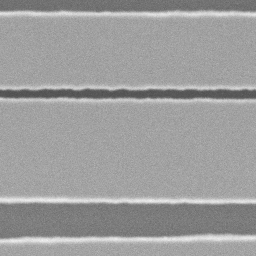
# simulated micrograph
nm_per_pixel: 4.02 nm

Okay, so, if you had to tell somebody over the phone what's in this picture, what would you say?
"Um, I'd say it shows lines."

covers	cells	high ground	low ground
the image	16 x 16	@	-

----------------
@@@@@@@@@@@@@@@@
@@@@@@@@@@@@@@@@
@@@@@@@@@@@@@@@@
@@@@@@@@@@@@@@@@
@@@@@@@@@@@@@@@@
@@@@@@@@@@@@@@@@
@@@@@@@@@@@@@@@@
@@@@@@@@@@@@@@@@
@@@@@@@@@@@@@@@@
@@@@@@@@@@@@@@@@
@@@@@@@@@@@@@@@@
@@@@@@@@@@@@@@@@
----------------
----------------
@@@@@@@@@@@@@@@@